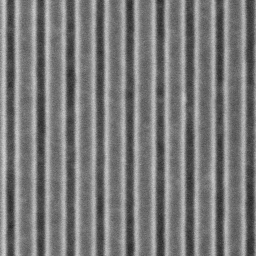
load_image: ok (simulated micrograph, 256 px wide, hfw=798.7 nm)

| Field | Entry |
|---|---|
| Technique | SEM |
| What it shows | parallel lines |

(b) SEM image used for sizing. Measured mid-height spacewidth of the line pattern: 32.7 nanometres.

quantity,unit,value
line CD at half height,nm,59.6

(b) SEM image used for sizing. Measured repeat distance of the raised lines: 93.1 nm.